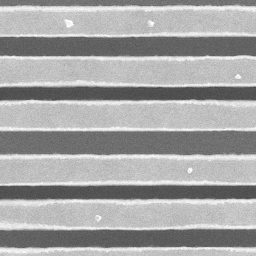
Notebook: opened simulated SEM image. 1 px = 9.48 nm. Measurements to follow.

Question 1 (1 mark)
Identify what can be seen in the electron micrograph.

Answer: lines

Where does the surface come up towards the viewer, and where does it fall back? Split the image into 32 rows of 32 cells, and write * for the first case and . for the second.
................................
********************************
********************************
********************************
********************************
................................
................................
********************************
********************************
********************************
********************************
................................
.......................****.....
********************************
********************************
********************************
................................
................................
................................
********************************
********************************
********************************
********************************
................................
................................
********************************
********************************
********************************
********************************
................................
................................
********************************